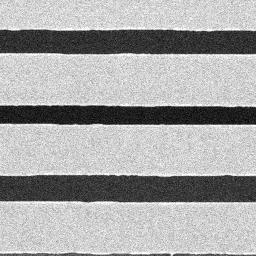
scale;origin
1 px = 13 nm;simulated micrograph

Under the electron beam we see lines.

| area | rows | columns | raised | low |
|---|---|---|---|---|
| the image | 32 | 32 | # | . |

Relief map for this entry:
################################
################################
################################
################################
................................
................................
................................
################################
################################
################################
################################
################################
################################
................................
................................
................................
################################
################################
################################
################################
################################
################################
................................
................................
................................
################################
################################
################################
################################
################################
################################
################################